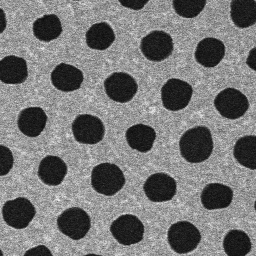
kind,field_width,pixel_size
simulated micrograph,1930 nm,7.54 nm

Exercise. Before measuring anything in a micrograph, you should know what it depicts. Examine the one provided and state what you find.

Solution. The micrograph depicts a regular array of holes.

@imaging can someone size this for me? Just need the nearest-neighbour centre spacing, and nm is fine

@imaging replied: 400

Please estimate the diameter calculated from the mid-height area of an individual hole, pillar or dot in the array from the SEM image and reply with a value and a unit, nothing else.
236 nm